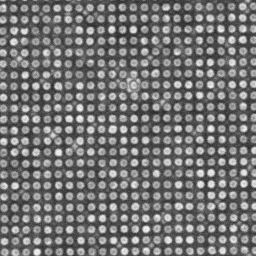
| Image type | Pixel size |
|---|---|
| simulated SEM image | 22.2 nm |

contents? a regular array of raised bodies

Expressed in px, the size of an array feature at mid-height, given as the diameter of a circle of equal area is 6.28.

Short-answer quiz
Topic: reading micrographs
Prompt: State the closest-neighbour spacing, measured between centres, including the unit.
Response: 0.236 micrometres